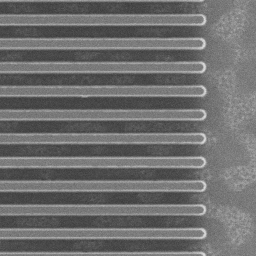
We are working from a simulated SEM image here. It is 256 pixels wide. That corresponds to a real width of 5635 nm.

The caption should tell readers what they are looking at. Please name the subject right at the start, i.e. parallel lines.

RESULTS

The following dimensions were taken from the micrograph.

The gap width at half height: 305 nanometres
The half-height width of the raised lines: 9.87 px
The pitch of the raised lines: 522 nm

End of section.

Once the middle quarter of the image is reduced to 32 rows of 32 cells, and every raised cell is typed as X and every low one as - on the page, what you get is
XXXXXXXXXXXXXXXXXXXXXXXXXXXXXXXX
XXXXXXXXXXXXXXXXXXXXXXXXXXXXXXXX
--------------------------------
--------------------------------
--------------------------------
--------------------------------
XXXXXXXXXXXXXXXXXXXXXXXXXXXXXXXX
XXXXXXXXXXXXXXXXXXXXXXXXXXXXXXXX
--------------------------------
--------------------------------
--------------------------------
--------------------------------
XXXXXXXXXXXXXXXXXXXXXXXXXXXXXXXX
XXXXXXXXXXXXXXXXXXXXXXXXXXXXXXXX
--------------------------------
--------------------------------
--------------------------------
--------------------------------
XXXXXXXXXXXXXXXXXXXXXXXXXXXXXXXX
XXXXXXXXXXXXXXXXXXXXXXXXXXXXXXXX
--------------------------------
--------------------------------
--------------------------------
------------------------XXXXXXXX
XXXXXXXXXXXXXXXXXXXXXXXXXXXXXXXX
XXXXXXXXXXXXXXXXXXXXXXXXXXXXXXXX
--------------------------------
--------------------------------
--------------------------------
XXXXXXXXXXXXXXXXXXXXXXXXXXXXXXXX
XXXXXXXXXXXXXXXXXXXXXXXXXXXXXXXX
XXXXXXXXXXXXXXXXXXXXXXXXXXXXXXXX